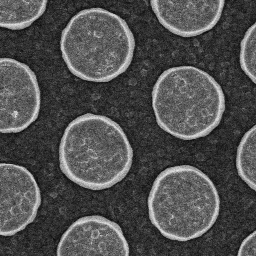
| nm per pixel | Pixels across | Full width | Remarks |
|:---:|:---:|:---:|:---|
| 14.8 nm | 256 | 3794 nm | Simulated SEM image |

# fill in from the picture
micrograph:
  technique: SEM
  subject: raised bodies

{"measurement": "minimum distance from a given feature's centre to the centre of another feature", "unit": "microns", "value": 1.51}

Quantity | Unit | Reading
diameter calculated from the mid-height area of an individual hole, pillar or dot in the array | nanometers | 1040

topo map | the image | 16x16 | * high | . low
***.......****..
**..****..***...
....****.......*
....****.......*
**...**...***..*
**........****..
**........****..
**...**...****..
....****...*...*
....****.......*
*...****...*...*
**...**...***...
**.......*****..
**.......****...
*...***...***...
....****.......*